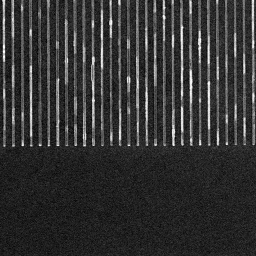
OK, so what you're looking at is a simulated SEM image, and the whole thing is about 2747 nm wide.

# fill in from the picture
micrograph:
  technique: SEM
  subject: parallel lines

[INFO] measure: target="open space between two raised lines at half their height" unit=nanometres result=79.1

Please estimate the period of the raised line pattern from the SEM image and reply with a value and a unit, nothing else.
95.4 nm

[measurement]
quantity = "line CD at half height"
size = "16.1 nm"